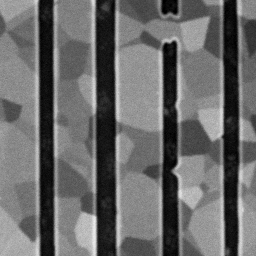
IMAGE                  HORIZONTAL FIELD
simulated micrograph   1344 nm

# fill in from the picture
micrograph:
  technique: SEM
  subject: one or a few lines or trenches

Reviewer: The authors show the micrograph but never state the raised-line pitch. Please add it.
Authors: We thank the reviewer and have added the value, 330 nm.